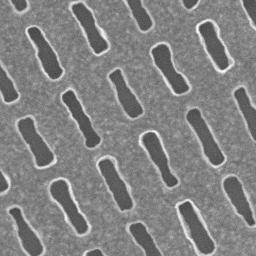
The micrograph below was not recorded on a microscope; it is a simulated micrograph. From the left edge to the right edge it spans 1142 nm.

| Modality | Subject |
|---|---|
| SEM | a regular array of holes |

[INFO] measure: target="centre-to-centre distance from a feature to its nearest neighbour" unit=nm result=226